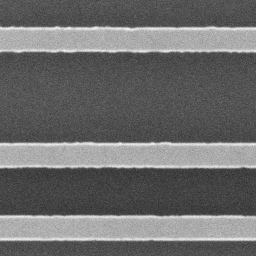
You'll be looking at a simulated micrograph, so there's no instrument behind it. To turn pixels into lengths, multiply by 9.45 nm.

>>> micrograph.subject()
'lines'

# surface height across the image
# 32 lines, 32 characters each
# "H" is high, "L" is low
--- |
LLLLLLLLLLLLLLLLLLLLLLLLLLLLLLLL
LLLLLLLLLLLLLLLLLLLLLLLLLLLLLLLL
LLLLLLLLLLLLLLLLLLLLLLLLLLLLLLLL
HHHLLLHHLLLHHHLLLLLLLLLLLLHLLLLL
HHHHHHHHHHHHHHHHHHHHHHHHHHHHHHHH
HHHHHHHHHHHHHHHHHHHHHHHHHHHHHHHH
LLLLLLLLLLLLLLLLLLLLLLLLLLLLLLLL
LLLLLLLLLLLLLLLLLLLLLLLLLLLLLLLL
LLLLLLLLLLLLLLLLLLLLLLLLLLLLLLLL
LLLLLLLLLLLLLLLLLLLLLLLLLLLLLLLL
LLLLLLLLLLLLLLLLLLLLLLLLLLLLLLLL
LLLLLLLLLLLLLLLLLLLLLLLLLLLLLLLL
LLLLLLLLLLLLLLLLLLLLLLLLLLLLLLLL
LLLLLLLLLLLLLLLLLLLLLLLLLLLLLLLL
LLLLLLLLLLLLLLLLLLLLLLLLLLLLLLLL
LLLLLLLLLLLLLLLLLLLLLLLLLLLLLLLL
LLLLLLLLLLLLLLLLLLLLLLLLLLLLLLLL
LLLLLLLLLLLLLLLLLLLLLLLLLLLLLLLL
HHHHHHHHHHHHHHHHHHHHHHHHHHHHHHHH
HHHHHHHHHHHHHHHHHHHHHHHHHHHHHHHH
HHHHHHHHHHHHHHHHHHHHHHHHHHHHHHHH
LLLLLLLLLLLLLLLLLLLLLLLLLLLLLLLL
LLLLLLLLLLLLLLLLLLLLLLLLLLLLLLLL
LLLLLLLLLLLLLLLLLLLLLLLLLLLLLLLL
LLLLLLLLLLLLLLLLLLLLLLLLLLLLLLLL
LLLLLLLLLLLLLLLLLLLLLLLLLLLLLLLL
LLLLLLLLLLLLLLLLLLLLLLLLLLLLLLLL
HHHHHHHHHHHHHHHHHHHHHHHHHHHHHHHH
HHHHHHHHHHHHHHHHHHHHHHHHHHHHHHHH
HHHHHHHHHHHHHHHHHHHHHHHHHHHHHHHH
LLLLLLLLLLLLLLLLLLLLLLLLLLLLLLLL
LLLLLLLLLLLLLLLLLLLLLLLLLLLLLLLL